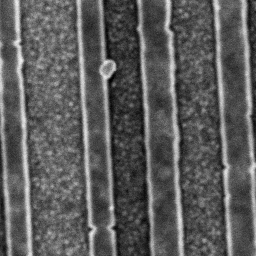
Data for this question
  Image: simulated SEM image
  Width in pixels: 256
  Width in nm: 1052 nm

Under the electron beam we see one or a few lines or trenches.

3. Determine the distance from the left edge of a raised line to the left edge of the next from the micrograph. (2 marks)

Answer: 296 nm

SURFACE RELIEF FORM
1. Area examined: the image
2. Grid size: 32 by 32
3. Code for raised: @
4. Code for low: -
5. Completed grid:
@@--------@@@----@@@@------@@@@-
@@--------@@@----@@@@------@@@@-
@@--------@@@----@@@@------@@@@-
@@--------@@@----@@@@------@@@@-
@@--------@@@-----@@@@-----@@@@-
@@--------@@@-----@@@------@@@@-
@@--------@@@-----@@@@-----@@@@-
@@@-------@@@@----@@@@-----@@@@-
@@@-------@@@@----@@@@-----@@@@-
@@@-------@@@@----@@@@-----@@@@-
@@@-------@@@-----@@@@-----@@@@-
@@@-------@@@-----@@@@------@@@-
@@@-------@@@-----@@@@------@@@-
@@@-------@@@-----@@@@------@@@-
@@@--------@@-----@@@@------@@@-
@@@--------@@@----@@@@------@@@-
@@@--------@@@----@@@@------@@@-
@@@--------@@@----@@@@------@@@-
@@@--------@@@----@@@@------@@@@
@@@--------@@@----@@@@------@@@@
-@@--------@@@----@@@@------@@@@
-@@--------@@@----@@@@------@@@@
-@@--------@@@-----@@@------@@@@
-@@--------@@@-----@@@------@@@@
-@@--------@@@-----@@@------@@@@
-@@--------@@@-----@@@------@@@@
-@@@-------@@@-----@@@@-----@@@@
-@@@-------@@@-----@@@@-----@@@@
-@@@-------@@@-----@@@@-----@@@@
-@@@-------@@@-----@@@@------@@@
-@@@-------@@@-----@@@@------@@@
-@@@-------@@@-----@@@@------@@@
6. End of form